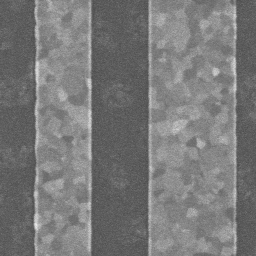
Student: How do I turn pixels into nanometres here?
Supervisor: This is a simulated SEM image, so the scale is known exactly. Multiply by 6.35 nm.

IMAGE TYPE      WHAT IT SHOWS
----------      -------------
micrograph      one or a few lines or trenches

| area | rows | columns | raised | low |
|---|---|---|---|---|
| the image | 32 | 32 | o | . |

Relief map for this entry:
.....oooooo........oooooooooo...
.....oooooo........oooooooooo...
.....oooooo........oooooooooo...
.....oooooo........oooooooooo...
.....oooooo........oooooooooo...
.....oooooo........oooooooooo...
.....oooooo........oooooooooo...
.....oooooo........oooooooooo...
.....oooooo........oooooooooo...
.....oooooo........oooooooooo...
.....oooooo........oooooooooo...
.....oooooo........oooooooooo...
.....oooooo........oooooooooo...
....ooooooo........oooooooooo...
.....oooooo........oooooooooo...
.....oooooo........oooooooooo...
.....oooooo........oooooooooo...
.....oooooo........oooooooooo...
.....oooooo........oooooooooo...
.....oooooo........oooooooooo...
.....oooooo........oooooooooo...
.....oooooo........oooooooooo...
.....oooooo........oooooooooo...
.....oooooo........oooooooooo...
....ooooooo........oooooooooo...
.....oooooo........oooooooooo...
.....oooooo........oooooooooo...
.....oooooo........oooooooooo...
.....oooooo........oooooooooo...
.....oooooo........oooooooooo...
....ooooooo........oooooooooo...
.....oooooo........oooooooooo...